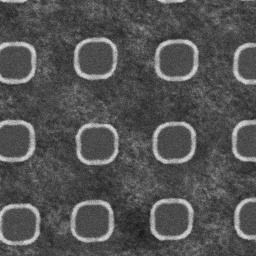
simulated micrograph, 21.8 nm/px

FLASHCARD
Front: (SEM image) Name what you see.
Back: raised bodies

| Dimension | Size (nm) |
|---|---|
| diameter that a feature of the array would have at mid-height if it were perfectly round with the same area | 892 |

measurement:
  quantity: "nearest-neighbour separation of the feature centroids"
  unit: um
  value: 1.69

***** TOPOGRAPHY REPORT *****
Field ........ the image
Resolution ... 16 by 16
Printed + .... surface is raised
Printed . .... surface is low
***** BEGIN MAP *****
................
................
................
++...++...++...+
++...++...++...+
................
................
................
++...++...++...+
++...++...++...+
................
................
................
++...++...++...+
++...++...++...+
................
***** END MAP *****